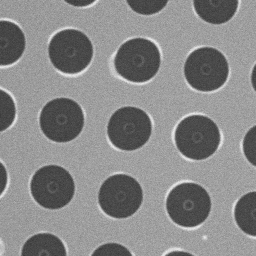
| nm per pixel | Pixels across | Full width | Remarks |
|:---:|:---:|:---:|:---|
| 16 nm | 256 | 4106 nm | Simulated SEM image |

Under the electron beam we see an array of small figures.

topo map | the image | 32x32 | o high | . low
ooooooooo...oooo.....ooo......oo
ooooooooooooooooo...oooo......oo
.oooooooooooooooooooooooo....ooo
...ooooooooooooooooooooooooooooo
...oooo....ooooooooooooooooooooo
o..ooo......ooo.....oooooooooooo
...ooo......oo......oooo....oooo
..oooo.....ooo......ooo.....oooo
ooooooo....ooo......ooo......ooo
ooooooooooooooo....oooo......oo.
oooooooooooooooooooooooo....ooo.
.oooooooooooooooooooooooo.oooooo
..oooo...ooooooooooooooooooooooo
..ooo.....ooooo..ooooooooooooooo
..ooo......ooo.....oooo...oooooo
..ooo......oo......ooo.....ooooo
ooooo.....ooo......ooo......ooo.
oooooo...ooooo.....ooo..o...oo..
oooooooooooooo....oooo.....ooo..
ooooooooooooooooooooooo...ooooo.
ooooooooooooooooooooooooooooooo.
.ooo.....ooooooooooooooooooooooo
.ooo.....oooo....ooooooooooooooo
.ooo.....ooo......ooo....ooooooo
oooo.....ooo......ooo.....oooo..
ooooo...oooo......ooo.....ooo...
ooooooooooooo....oooo.....ooo...
ooooooooooooooooooooo.....ooo...
ooooooooooooooooooooooo.oooooo..
oooo...oooooooooooooooooooooooo.
ooo.....ooooo..ooooooooooooooooo
ooo.....oooo....ooooo..ooooooooo